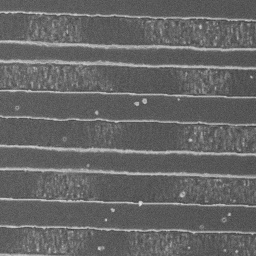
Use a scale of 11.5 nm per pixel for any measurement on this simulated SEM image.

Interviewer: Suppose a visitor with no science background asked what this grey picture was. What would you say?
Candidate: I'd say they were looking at lines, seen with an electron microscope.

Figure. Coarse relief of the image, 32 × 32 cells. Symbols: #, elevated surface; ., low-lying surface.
################################
################################
.............................###
................................
................................
######..........................
################################
################################
............................####
................................
................................
########........................
################################
################################
################################
............................####
................................
................................
#####...........................
################################
################################
.............###################
................................
................................
................................
#######################.........
################################
################################
...........#####################
................................
................................
................................